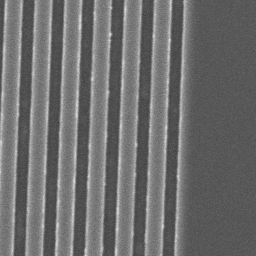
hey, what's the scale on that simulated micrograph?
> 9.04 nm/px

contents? parallel lines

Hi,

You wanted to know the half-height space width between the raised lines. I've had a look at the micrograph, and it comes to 117 nm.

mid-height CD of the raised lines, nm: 149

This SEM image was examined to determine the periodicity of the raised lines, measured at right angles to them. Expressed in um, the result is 0.27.